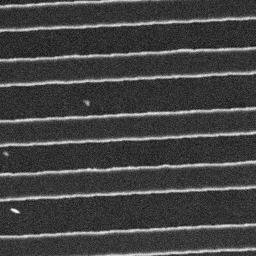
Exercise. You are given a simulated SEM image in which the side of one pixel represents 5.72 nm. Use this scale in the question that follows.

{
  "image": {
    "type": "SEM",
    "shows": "lines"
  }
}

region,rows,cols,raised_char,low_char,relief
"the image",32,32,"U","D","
DDDDDUUUUUUUUUUUUUUUUUUUUUUUUUUU
UUUUUUUUUUUUUUUUUUUUUUUUUUUUUUUU
UUUUUUUUUUUUUUUUUUUUUUUUUUUUUDDD
UUUUUUUUDDDDDDDDDDDDDDDDDDDDDDDD
DDDDDDDDDDDDDDDDDDDDDDDDDDDDDDDD
DDDDDDDDDDDDDDDDDDDDDDDDDDDDDDDD
DDDDDDDDDDDDDDDDDDDDUUUUUUUUUUUU
DUUUUUUUUUUUUUUUUUUUUUUUUUUUUUUU
UUUUUUUUUUUUUUUUUUUUUUUUUUUUUUUU
UUUUUUUUUUUUUUUUUUUUUUUUUDDDDDDD
UUUUUDDDDDDDDDDDDDDDDDDDDDDDDDDD
DDDDDDDDDDDDDDDDDDDDDDDDDDDDDDDD
DDDDDDDDDDDDDDDDDDDDDDDDDDDDDDDD
DDDDDDDDDDDDDDDDDDDDDDDDDDDDDDDD
DDDDDDDDDDDDDUUUUUUUUUUUUUUUUUUU
UUUUUUUUUUUUUUUUUUUUUUUUUUUUUUUU
UUUUUUUUUUUUUUUUUUUUUUUUUUUUUUUU
UUUUUUUUUUUUUUUUDDDDDDDDDDDDDDDD
DDDDDDDDDDDDDDDDDDDDDDDDDDDDDDDD
DDDDDDDDDDDDDDDDDDDDDDDDDDDDDDDD
DDDDDDDDDDDDDDDDDDDDDDDDDDDDUUUU
DDDDDUUUUUUUUUUUUUUUUUUUUUUUUUUU
UUUUUUUUUUUUUUUUUUUUUUUUUUUUUUUU
UUUUUUUUUUUUUUUUUUUUUUUUUUUUUUUU
UUUUUUUUUUDDDDDDDDDDDDDDDDDDDDDD
DDDDDDDDDDDDDDDDDDDDDDDDDDDDDDDD
DDDDDDDDDDDDDDDDDDDDDDDDDDDDDDDD
DDDDDDDDDDDDDDDDDDDDDDDDDDDDDDDD
DDDDDDDDDDDDDDDDDDDDDDUUUUUUUUUU
DDDUUUUUUUUUUUUUUUUUUUUUUUUUUUUU
UUUUUUUUUUUUUUUUUUUUUUUUUUUUUUUU
UUUUUUUUUUUUUUUUUUUUUUUUUUDDDDDD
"